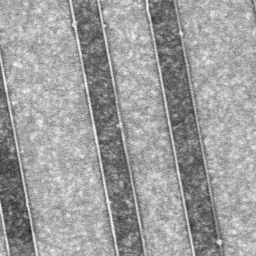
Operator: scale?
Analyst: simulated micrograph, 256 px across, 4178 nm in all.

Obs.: one or a few lines or trenches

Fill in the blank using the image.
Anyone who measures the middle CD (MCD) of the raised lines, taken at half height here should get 453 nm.